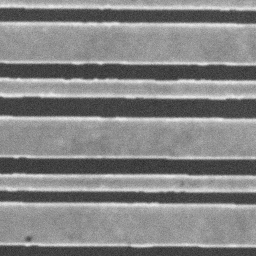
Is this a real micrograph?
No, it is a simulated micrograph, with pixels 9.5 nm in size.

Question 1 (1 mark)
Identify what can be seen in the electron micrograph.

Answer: lines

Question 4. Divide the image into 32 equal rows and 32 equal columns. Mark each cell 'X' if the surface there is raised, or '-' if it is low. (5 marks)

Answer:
XXXXXXXXXXXXXXXXXXXXXXXXXXXXXXXX
--------------------------------
--------------------------------
XXXXXXXXXXXXXXXXXXXXXXXXXXXXXXXX
XXXXXXXXXXXXXXXXXXXXXXXXXXXXXXXX
XXXXXXXXXXXXXXXXXXXXXXXXXXXXXXXX
XXXXXXXXXXXXXXXXXXXXXXXXXXXXXXXX
XXXXXXXXXXXXXXXXXXXXXXXXXXXXXXXX
--------------------------------
--------------------------------
XXXXXXXXXXXXXXXXXXXXXXXXXXXXXXXX
XXXXXXXXXXXXXXXXXXXXXXXXXXXXXXXX
--------------------------------
--------------------------------
--------------------------------
XXXXXXXXXXXXXXXXXXXXXXXXXXXXXXXX
XXXXXXXXXXXXXXXXXXXXXXXXXXXXXXXX
XXXXXXXXXXXXXXXXXXXXXXXXXXXXXXXX
XXXXXXXXXXXXXXXXXXXXXXXXXXXXXXXX
XXXXXXXXXXXXXXXXXXXXXXXXXXXXXXXX
--------------------------------
--------------------------------
XXXXXXXXXXXXXXXXXXXXXXXXXXXXXXXX
XXXXXXXXXXXXXXXXXXXXXXXXXXXXXXXX
--------------------------------
XX------------------------------
XXXXXXXXXXXXXXXXXXXXXXXXXXXXXXXX
XXXXXXXXXXXXXXXXXXXXXXXXXXXXXXXX
XXXXXXXXXXXXXXXXXXXXXXXXXXXXXXXX
XXXXXXXXXXXXXXXXXXXXXXXXXXXXXXXX
XXXXXXXXXXXXXXXXXXXXXXXXXXXXXXXX
--------------------------------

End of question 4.